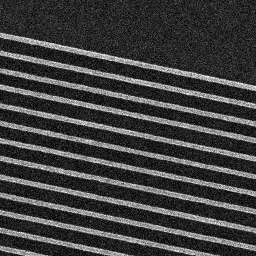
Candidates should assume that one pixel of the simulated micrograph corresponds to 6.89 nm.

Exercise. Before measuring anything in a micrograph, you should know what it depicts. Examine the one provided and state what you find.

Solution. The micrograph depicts parallel lines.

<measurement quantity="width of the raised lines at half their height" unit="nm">31.2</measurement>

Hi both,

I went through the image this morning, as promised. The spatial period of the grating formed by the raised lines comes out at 120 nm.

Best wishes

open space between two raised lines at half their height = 0.0877 micrometres